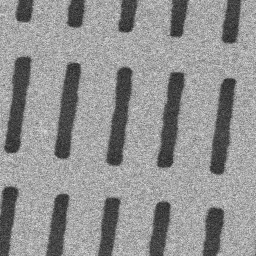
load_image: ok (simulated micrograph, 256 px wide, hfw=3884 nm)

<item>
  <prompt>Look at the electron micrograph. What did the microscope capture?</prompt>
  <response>holes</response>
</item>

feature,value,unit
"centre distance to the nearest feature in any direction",774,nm